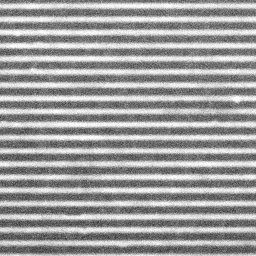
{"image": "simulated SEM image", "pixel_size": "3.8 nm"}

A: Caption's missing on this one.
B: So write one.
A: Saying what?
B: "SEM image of parallel lines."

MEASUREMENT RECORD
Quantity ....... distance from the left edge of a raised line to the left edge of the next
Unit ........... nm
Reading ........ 50.2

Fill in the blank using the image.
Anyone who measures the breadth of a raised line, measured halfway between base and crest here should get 13.8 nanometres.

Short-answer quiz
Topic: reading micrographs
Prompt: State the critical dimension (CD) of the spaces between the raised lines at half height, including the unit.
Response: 38.5 nm